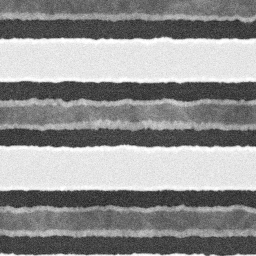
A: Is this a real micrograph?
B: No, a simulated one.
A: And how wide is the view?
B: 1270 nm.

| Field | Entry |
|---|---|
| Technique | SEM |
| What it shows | lines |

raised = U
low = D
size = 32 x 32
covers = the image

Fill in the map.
UUUUUUUUUUUUUUUUUUUUUUUUUUUUUUUU
UUUUUUUUUUUUUUUUUUUUUUUUUUUUUUUU
DDDDDDDDDDDDDDDDDDDDDDDDDDDDDDUU
DDDDDDDDDDDDDDDDDDDDDDDDDDDDDDDD
DDDDDDDDDDDDDDDDDDDDDDDDDDDDDDDD
UUUUUUUUUUUUUUUUUUUUUUUUUUUUUUUU
UUUUUUUUUUUUUUUUUUUUUUUUUUUUUUUU
UUUUUUUUUUUUUUUUUUUUUUUUUUUUUUUU
UUUUUUUUUUUUUUUUUUUUUUUUUUUUUUUU
UUUUUUUUUUUUUUUUUUUUUUUUUUUUUUUU
DDDDDDDDDDDDDDDDDDDDDDDDDDDDDDDD
DDDDDDDDDDDDDDDDDDDDDDDDDDDDDDDD
DDDDDDDDDDDDDDDDDDDDDDDDDDDDDDDD
UUUUUUUUUUUUUUUUUUUUUUUUUUUUUUUU
UUUUUUUUUUUUUUUUUUUUUUUUUUUUUUUU
UUUUUUUUUUUUUUUUUUUUUUUUUUUUUUUU
DDDDDDDDDDDDDDDDDDDDDDDDDDDDDDDD
DDDDDDDDDDDDDDDDDDDDDDDDDDDDDDDD
UUUUUUUUUUUUUUUUUUUUUUUUUUUUUUUU
UUUUUUUUUUUUUUUUUUUUUUUUUUUUUUUU
UUUUUUUUUUUUUUUUUUUUUUUUUUUUUUUU
UUUUUUUUUUUUUUUUUUUUUUUUUUUUUUUU
UUUUUUUUUUUUUUUUUUUUUUUUUUUUUUUU
UUUUUUUUUUUUUUUUUUUUUUUUUUUUUUUU
DDDDDDDDDDDDDDDDDDDDDDDDDDDDDDDD
DDDDDDDDDDDDDDDDDDDDDDDDDDDDDDDD
UUUUUUUUUUUUUUUUUUUUUUUUUUUUUUUU
UUUUUUUUUUUUUUUUUUUUUUUUUUUUUUUU
UUUUUUUUUUUUUUUUUUUUUUUUUUUUUUUU
DDDDDDDDDDDDDDDDDDDDDDDDDDDDDDDD
DDDDDDDDDDDDDDDDDDDDDDDDDDDDDDDD
DDDDDDDDDDDDDDDDDDDDDDDDDDDDDDDD